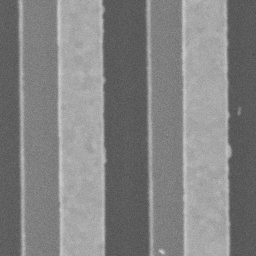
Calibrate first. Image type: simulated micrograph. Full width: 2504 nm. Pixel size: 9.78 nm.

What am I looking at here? lines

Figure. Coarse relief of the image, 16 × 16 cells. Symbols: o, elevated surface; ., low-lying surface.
.ooooo...ooooo..
.ooooo...ooooo..
.ooooo...ooooo..
.ooooo...ooooo..
.ooooo...ooooo..
.ooooo...ooooo..
.ooooo...ooooo..
.ooooo...ooooo..
.ooooo...ooooo..
.oooooo..ooooo..
.oooooo..ooooo..
.oooooo..ooooo..
.oooooo..ooooo..
.oooooo...oooo..
.oooooo...oooo..
.oooooo...oooo..